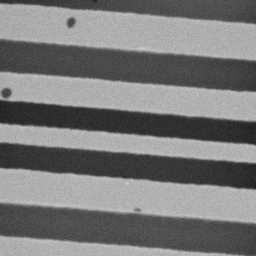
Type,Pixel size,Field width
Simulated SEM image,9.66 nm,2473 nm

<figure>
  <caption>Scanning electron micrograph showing lines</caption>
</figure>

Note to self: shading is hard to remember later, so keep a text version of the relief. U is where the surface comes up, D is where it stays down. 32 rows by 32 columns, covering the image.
UDDDDDDDDDDDDDDDDDDDDDDDDDDDDDDD
UUUUUUUUUUUUUDDDDDDDDDDDDDDDDDDD
UUUUUUUUUUUUUUUUUUUUUUUUDDDDDDDD
UUUUUUUUUUUUUUUUUUUUUUUUUUUUUUUU
UUUUUUUUUUUUUUUUUUUUUUUUUUUUUUUU
DDDDDDDDUUUUUUUUUUUUUUUUUUUUUUUU
DDDDDDDDDDDDDDDDDDDUUUUUUUUUUUUU
DDDDDDDDDDDDDDDDDDDDDDDDDDDDDDDD
DDDDDDDDDDDDDDDDDDDDDDDDDDDDDDDD
UUUUUUDDDDDDDDDDDDDDDDDDDDDDDDDD
UUUUUUUUUUUUUUUUUUDDDDDDDDDDDDDD
UUUUUUUUUUUUUUUUUUUUUUUUUUUUUUUD
DUUUUUUUUUUUUUUUUUUUUUUUUUUUUUUU
DDDDDDDDDDDDDUUUUUUUUUUUUUUUUUUU
DDDDDDDDDDDDDDDDDDDDDDDDDUUUUUUU
UDDDDDDDDDDDDDDDDDDDDDDDDDDDDDDD
UUUUUUUUUUUUUDDDDDDDDDDDDDDDDDDD
UUUUUUUUUUUUUUUUUUUUUUUDDDDDDDDD
DDDDDDDDDDUUUUUUUUUUUUUUUUUUUUUU
DDDDDDDDDDDDDDDDDDDDDUUUUUUUUUUU
DDDDDDDDDDDDDDDDDDDDDDDDDDDDDDDD
UUUUUDDDDDDDDDDDDDDDDDDDDDDDDDDD
UUUUUUUUUUUUUUUUUDDDDDDDDDDDDDDD
UUUUUUUUUUUUUUUUUUUUUUUUUUUUUDDD
UUUUUUUUUUUUUUUUUUUUUUUUUUUUUUUU
DDDUUUUUUUUUUUUUUUUUUUUUUUUUUUUU
DDDDDDDDDDDDDDDDUUUUUUUUUUUUUUUU
DDDDDDDDDDDDDDDDDDDDDDDDDDDDUUUU
DDDDDDDDDDDDDDDDDDDDDDDDDDDDDDDD
DDDDDDDDDDDDDDDDDDDDDDDDDDDDDDDD
UUUUUUUUUUUUUDDDDDDDDDDDDDDDDDDD
UUUUUUUUUUUUUUUUUUUUUUUUDDDDDDDD